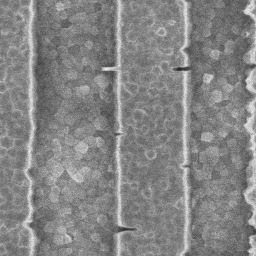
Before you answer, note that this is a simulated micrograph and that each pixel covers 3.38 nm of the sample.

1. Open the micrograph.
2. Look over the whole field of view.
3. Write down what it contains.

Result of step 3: one or a few lines or trenches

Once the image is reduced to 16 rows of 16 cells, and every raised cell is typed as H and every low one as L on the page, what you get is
HHLLLLLHHHHHLLLL
HHLLLLLHHHHHLLLL
HHLLLLLHHHHHLLLL
HHLLLLLHHHHHLLLL
HHLLLLLHHHHLLLLL
HHLLLLLHHHHHLLLL
HHLLLLLHHHHHLLLL
HHLLLLLHHHHHLLLL
HHLLLLLHHHHHLLLL
HHLLLLLHHHHHLLLL
HHLLLLLHHHHHLLLL
HHLLLLLHHHHHLLLL
HHLLLLLHHHHHLLLL
HHLLLLLHHHHHLLLL
HHLLLLLLHHHHLLLL
HHLLLLLHHHHHLLLL